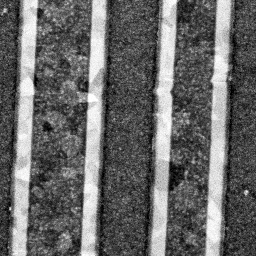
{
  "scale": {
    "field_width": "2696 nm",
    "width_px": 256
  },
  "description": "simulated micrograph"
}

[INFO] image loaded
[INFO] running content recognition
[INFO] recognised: one or a few lines or trenches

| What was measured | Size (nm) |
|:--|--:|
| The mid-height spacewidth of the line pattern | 746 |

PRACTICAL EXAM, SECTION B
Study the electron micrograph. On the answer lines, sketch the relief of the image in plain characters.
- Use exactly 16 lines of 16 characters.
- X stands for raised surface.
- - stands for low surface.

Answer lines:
--XXXX-----XXX--
--XXXX-----XXX--
--XXXX-----XXX--
--XXXX-----XXX--
--XXXX----XXXX--
--XXXX----XXXX--
--XXXX----XXXX--
--XXXX----XXXX--
--XXXX----XXXX--
--XXXX----XXXX--
-XXXXX----XXXX--
-XXXXX----XXX---
-XXXXX----XXX---
-XXXXX----XXX---
-XXXXX----XXX---
-XXXX-----XXX---